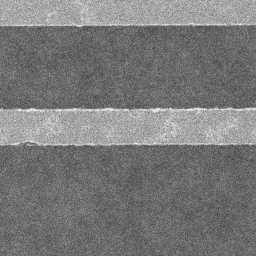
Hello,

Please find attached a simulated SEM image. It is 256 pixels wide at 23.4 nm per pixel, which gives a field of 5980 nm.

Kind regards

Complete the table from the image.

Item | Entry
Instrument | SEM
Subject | one or a few lines or trenches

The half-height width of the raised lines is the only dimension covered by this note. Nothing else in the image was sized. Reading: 35.3 pixels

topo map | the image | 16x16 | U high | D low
UUUUUUUUUUUUUUUU
UUUUUUUUUUUUUUUU
DDDDDDDDDDDDDDDD
DDDDDDDDDDDDDDDD
DDDDDDDDDDDDDDDD
DDDDDDDDDDDDDDDD
DDDDDDDDDDDDDDDD
UUUUUUUUUUUUUUUU
UUUUUUUUUUUUUUUU
DDDDDDDDDDDDDDDD
DDDDDDDDDDDDDDDD
DDDDDDDDDDDDDDDD
DDDDDDDDDDDDDDDD
DDDDDDDDDDDDDDDD
DDDDDDDDDDDDDDDD
DDDDDDDDDDDDDDDD